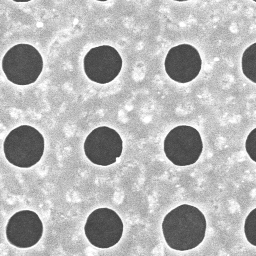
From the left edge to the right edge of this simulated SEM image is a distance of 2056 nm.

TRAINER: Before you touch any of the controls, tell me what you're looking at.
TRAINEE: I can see a regular array of holes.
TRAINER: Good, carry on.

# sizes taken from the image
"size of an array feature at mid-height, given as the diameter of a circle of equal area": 318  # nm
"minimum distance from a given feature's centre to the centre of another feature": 642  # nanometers